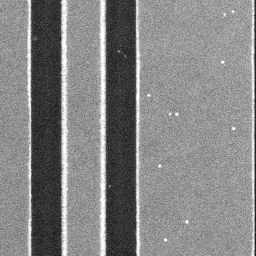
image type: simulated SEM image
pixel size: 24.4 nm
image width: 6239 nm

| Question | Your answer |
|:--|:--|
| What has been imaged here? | lines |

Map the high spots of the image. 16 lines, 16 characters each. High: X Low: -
XX--XXX--XXXXXXX
XX--XXX--XXXXXXX
XX--XXX--XXXXXXX
XX--XXX--XXXXXXX
XX--XXX--XXXXXXX
XX--XXX--XXXXXXX
XX--XXX--XXXXXXX
XX--XXX--XXXXXXX
XX--XXX--XXXXXXX
XX--XXX--XXXXXXX
XX--XXX--XXXXXXX
XX--XXX--XXXXXXX
XX--XXX--XXXXXXX
XX--XXX--XXXXXXX
XX--XXX--XXXXXXX
XX--XXX--XXXXXXX